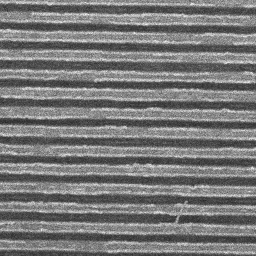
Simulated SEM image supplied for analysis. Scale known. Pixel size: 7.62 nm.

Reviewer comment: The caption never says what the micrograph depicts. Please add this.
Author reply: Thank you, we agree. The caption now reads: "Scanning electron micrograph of parallel lines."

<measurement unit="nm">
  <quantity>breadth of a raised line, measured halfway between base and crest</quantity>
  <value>84.8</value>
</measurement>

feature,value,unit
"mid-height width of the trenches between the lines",63.8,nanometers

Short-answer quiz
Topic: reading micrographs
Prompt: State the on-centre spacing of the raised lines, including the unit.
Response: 0.145 microns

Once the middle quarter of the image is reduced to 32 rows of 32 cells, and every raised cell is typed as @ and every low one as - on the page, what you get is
--------------------------------
--------------------------------
@@@@@@@@@@@@@@@@@@@@@@@@@@@@@@@@
@@@@@@@@@@@@@@@@@@@@@@@@@@@@@@@@
--------------------------------
--------------------------------
@@@@@@@@@@@@@@@@@@@@@@@@@@@@@@@@
@@@@@@@@@@@@@@@@@@@@@@@@@@@@@@@@
@@@@@@@@@@@@@@@@@@@@@@@@@@@@@@@@
--------------------------------
--------------------------------
@@@@@@@@@@@@@@@@@@@@@@@@@@@@@@@@
@@@@@@@@@@@@@@@@@@@@@@@@@@@@@@@@
@@@@@@@@@@@@@@@@@@@@@@@@@@@@@@@@
--------------------------------
--------------------------------
@@@@@@@@@@@@@@@@@@@@@@@@@@@@@@@@
@@@@@@@@@@@@@@@@@@@@@@@@@@@@@@@@
-------------------------@@@@@--
--------------------------------
-----@--------------------------
@@@@@@@@@@@@@@@@@@@@@@@@@@@@@@@@
@@@@@@@@@@@@@@@@@@@@@@@@@@@@@@@@
--------------------------------
--------------------------------
@@@@@@@@@@@@@@@@@@@@@@@@@@@@@@@@
@@@@@@@@@@@@@@@@@@@@@@@@@@@@@@@@
@@@@@@@@@@@@@@@@@@@@@@@@@@@@@@@@
--------------------------------
--------------------------------
@@@@@@@@@@@@@@@@@@@@@@@@@--@@@@@
@@@@@@@@@@@@@@@@@@@@@@@@@@@@@@@@